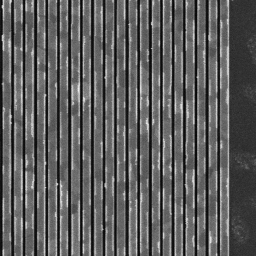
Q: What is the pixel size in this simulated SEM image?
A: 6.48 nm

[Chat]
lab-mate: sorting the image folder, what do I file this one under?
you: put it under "parallel lines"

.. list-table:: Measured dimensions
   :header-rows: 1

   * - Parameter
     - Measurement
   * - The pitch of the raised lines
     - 74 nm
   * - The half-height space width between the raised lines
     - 19.4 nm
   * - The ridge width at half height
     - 51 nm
